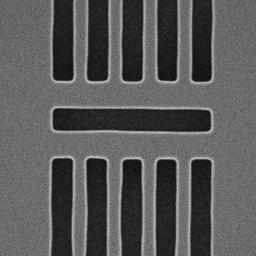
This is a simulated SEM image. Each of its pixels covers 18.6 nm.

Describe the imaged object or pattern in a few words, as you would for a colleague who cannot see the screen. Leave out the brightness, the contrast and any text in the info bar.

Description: groups of lines, slits or small figures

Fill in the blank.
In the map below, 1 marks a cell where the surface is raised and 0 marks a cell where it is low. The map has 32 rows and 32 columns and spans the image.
11111110011000100011001100011111
11111110011000100011001100011111
11111110011000100011001100011111
11111110011000100011001100011111
11111100011000100011001100011111
11111100011000100011001100011111
11111100011000100011001100011111
11111100011000100011001100011111
11111100011000100011001100011111
11111110011001100011001100011111
11111111111111111111111111111111
11111111111111111111111111111111
11111111111111111111111111111111
11111110000000000011111111111111
11111100000000000000000000111111
11111100000000000000000000011111
11111111111111111111110001111111
11111111111111111111111111111111
11111111111111111111111111111111
11111111111111111111111111111111
11111100011001100011001100111111
11111100011001100011001100011111
11111100011001100010001100011111
11111100011001100010001100011111
11111100011001100010001100011111
11111100011001100010001100111111
11111100011001100010001100111111
11111100011001100010001100111111
11111100011001100010001100011111
11111100011001100010001100111111
11111100011001100010001100111111
11111100011001100010001100111111